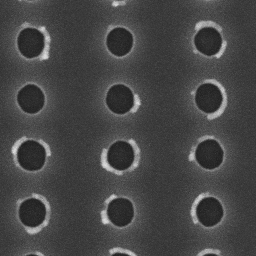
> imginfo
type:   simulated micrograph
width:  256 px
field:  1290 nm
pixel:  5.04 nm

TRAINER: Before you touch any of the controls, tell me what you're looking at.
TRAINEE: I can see a regular array of holes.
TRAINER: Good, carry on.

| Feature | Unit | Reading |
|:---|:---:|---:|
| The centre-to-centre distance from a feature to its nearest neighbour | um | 0.284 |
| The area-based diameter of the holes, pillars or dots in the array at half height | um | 0.148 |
